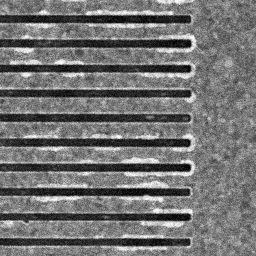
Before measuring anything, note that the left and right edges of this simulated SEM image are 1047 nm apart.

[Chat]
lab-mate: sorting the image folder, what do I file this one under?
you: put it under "parallel lines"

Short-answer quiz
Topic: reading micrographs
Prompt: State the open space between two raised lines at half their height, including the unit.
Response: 37.3 nm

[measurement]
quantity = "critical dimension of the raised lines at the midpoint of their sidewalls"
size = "63.8 nm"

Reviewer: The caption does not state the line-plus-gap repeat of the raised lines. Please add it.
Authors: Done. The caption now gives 101 nanometres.